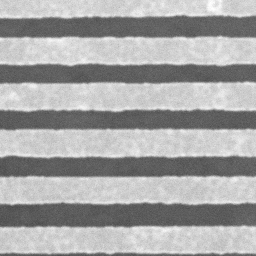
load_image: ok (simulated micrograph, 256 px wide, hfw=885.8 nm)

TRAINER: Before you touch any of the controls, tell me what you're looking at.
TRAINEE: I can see lines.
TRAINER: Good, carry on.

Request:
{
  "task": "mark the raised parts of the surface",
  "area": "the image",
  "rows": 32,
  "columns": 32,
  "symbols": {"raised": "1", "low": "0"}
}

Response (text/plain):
11111111111111111111111111111111
11111111111111111111111111111111
00000000000000000000000000000000
00000000000000000000000000000000
00000000000000000000000000000000
11111111111111111111111111111111
11111111111111111111111111111111
11111111111111111111111111111111
00000000000000000000000000000000
00000000000000000000000000000000
00111000000111110010111111111111
11111111111111111111111111111111
11111111111111111111111111111111
11111111111111111111111111111111
00000000000000000000000000000000
00000000000000000000000000000000
11111111111111111111111111111111
11111111111111111111111111111111
11111111111111111111111111111111
00000111110011110100111000000001
00000000000000000000000000000000
00000000000000000000000000000000
11111111111111111111111111111111
11111111111111111111111111111111
11111111111111111111111111111111
00000000000000000000000010000000
00000000000000000000000000000000
00000000000000000000000000000000
00001111100001111111111111111111
11111111111111111111111111111111
11111111111111111111111111111111
10111111101101000111111111111111